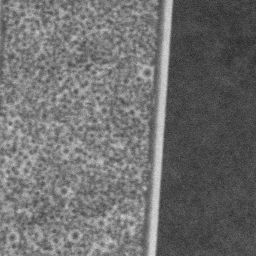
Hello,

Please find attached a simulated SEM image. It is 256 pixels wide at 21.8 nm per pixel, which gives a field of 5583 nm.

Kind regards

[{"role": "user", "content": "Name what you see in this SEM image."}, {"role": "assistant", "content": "one or a few lines or trenches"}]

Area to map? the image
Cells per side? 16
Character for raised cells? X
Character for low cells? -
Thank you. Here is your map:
XXXXXXXXXXX-----
XXXXXXXXXX------
XXXXXXXXXX------
XXXXXXXXXX------
XXXXXXXXXX------
XXXXXXXXXX------
XXXXXXXXXX------
XXXXXXXXXX------
XXXXXXXXXX------
XXXXXXXXXX------
XXXXXXXXXX------
XXXXXXXXXX------
XXXXXXXXXX------
XXXXXXXXXX------
XXXXXXXXXX------
XXXXXXXXXX------